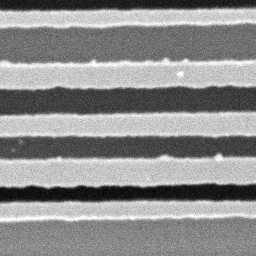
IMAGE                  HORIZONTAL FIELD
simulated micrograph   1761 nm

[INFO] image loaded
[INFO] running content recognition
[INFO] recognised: lines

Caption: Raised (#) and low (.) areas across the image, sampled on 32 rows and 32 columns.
................................
#####.##########################
################################
................................
................................
................................
................................
....................#...........
################################
################################
################################
................................
................................
................................
......####..####################
################################
################################
................................
................................
....................#......#....
################################
################################
################################
................................
................................
################################
################################
................................
................................
................................
................................
................................